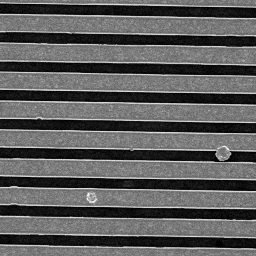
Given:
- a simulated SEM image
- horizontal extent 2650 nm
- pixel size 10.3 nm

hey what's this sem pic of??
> parallel lines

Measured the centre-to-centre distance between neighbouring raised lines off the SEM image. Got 298 nanometres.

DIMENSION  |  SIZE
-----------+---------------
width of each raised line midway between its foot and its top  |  16.9 pixels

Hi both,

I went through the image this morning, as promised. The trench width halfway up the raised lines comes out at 119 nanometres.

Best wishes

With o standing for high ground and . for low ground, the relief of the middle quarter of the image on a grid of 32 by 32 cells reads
................................
................................
oooooo..........................
oooooooooooooooooooooooooooooooo
oooooooooooooooooooooooooooooooo
oooooooooooooooooooooooooooooooo
.ooooooooooooooooooooooooooooooo
................................
................................
................................
oooooooooooooooooooooooooooooooo
oooooooooooooooooooooooooooooooo
oooooooooooooooooooooooooooooooo
oooooooooooooooooooooooooooooooo
................................
................................
................................
oooooooooooooooooooooooooooooooo
oooooooooooooooooooooooooooooooo
oooooooooooooooooooooooooooooooo
oooooooooooooooooooooooooooooooo
................o...............
................................
................................
oooooooooooooooooooooooooooooo..
oooooooooooooooooooooooooooooooo
oooooooooooooooooooooooooooooooo
oooooooooooooooooooooooooooooooo
..................ooooooooooo...
................................
................................
ooooooooooo.........o...........